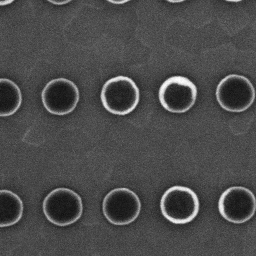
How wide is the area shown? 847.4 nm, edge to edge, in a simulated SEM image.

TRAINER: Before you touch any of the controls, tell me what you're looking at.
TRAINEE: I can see a regular array of raised bodies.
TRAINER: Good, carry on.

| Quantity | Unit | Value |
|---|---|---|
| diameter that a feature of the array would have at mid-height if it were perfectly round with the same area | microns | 0.123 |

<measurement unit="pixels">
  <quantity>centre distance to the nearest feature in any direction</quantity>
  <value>57.8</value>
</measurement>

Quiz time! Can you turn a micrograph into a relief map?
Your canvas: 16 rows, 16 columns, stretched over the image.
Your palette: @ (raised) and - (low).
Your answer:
----------------
----------------
----------------
----------------
----------------
@--@@-@@@-@@--@@
@--@@--@@-@@--@@
----------------
----------------
----------------
----------------
----------------
@--@@--@@-@@--@@
@--@@--@@-@@--@@
----------------
----------------